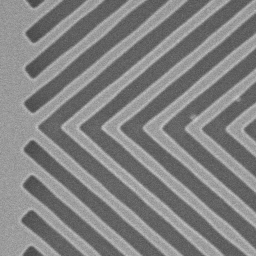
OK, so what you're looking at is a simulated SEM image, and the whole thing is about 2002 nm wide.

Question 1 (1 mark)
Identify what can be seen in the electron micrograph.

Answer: groups of lines, slits or small figures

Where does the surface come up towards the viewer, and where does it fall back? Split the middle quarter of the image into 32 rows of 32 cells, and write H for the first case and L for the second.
HLLLLLLHHHHLLLLLLHHHHLLLLLLHHHHH
LLLLLLHHHHLLLLLLHHHHLLLLLLLHHHHL
LLLLLHHHHLLLLLLHHHHLLLLLLHHHHLLL
LLLHHHHLLLLLLLHHHHLLLLLLHHHHLLLL
LLHHHHLLLLLLLHHHHLLLLLLHHHHLLLLL
LHHHHLLLLLLHHHHLLLLLLLHHHHLLLLLL
HHHHLLLLLLHHHHLLLLLLLHHHHLLLLLLH
HHHLLLLLLHHHHLLLLLLHHHHHLLLLLLHH
HHLLLLLHHHHHLLLLLLHHHHHLLLLLLHHH
LLLLLLHHHHHLLLLLLHHHHLLLLLLHHHHL
LLLLLHHHHHLLLLLLHHHHLLLLLLHHHHLL
LLLLHHHHHLLLLLHHHHHLLLLLLHHHHLLL
LLLHHHHLLLLLLHHHHHLLLLLLHHHHLLLL
LLHHHHLLLLLLHHHHHLLLLLLHHHHLLLLL
LHHHHLLLLLLHHHHLLLLLLHHHHHLLLLLL
HHHHLLLLLLHHHHLLLLLLHHHHHLLLLLLH
HHHHLLLLLLHHHHLLLLLLHHHHHLLLLLHH
LHHHHLLLLLLHHHHLLLLLLHHHHHLLLLLH
LLHHHHLLLLLLHHHHLLLLLLHHHHHLLLLL
LLLHHHHLLLLLLHHHHLLLLLLHHHHHLLLL
LLLLHHHHLLLLLLLHHHLLLLLLHHHHHLLL
LLLLLLHHHLLLLLLLHHHHLLLLLLHHHHLL
HLLLLLLHHHHLLLLLLHHHHLLLLLLHHHHL
HHLLLLLLHHHHLLLLLLHHHHLLLLLLHHHH
HHHLLLLLLHHHHLLLLLLHHHHLLLLLLHHH
HHHHLLLLLLHHHHLLLLLLHHHHLLLLLLHH
LHHHHLLLLLLHHHHLLLLLLHHHHLLLLLLH
LLHHHHLLLLLLLHHHLLLLLLLHHHHLLLLL
LLLHHHHLLLLLLLHHHLLLLLLLHHHLLLLL
LLLLLHHHLLLLLLLHHHHLLLLLLHHHHLLL
LLLLLHHHHHLLLLLLHHHHLLLLLLHHHHLL
HLLLLLLHHHHLLLLLLHHHHLLLLLLHHHHL